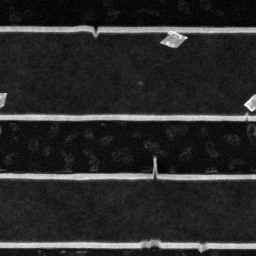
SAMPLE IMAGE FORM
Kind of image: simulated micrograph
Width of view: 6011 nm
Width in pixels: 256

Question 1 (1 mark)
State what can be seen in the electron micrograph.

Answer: one or a few lines or trenches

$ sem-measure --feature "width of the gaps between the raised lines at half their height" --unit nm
1370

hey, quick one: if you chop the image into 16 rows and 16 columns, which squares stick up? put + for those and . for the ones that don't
................
................
++++++++++++++++
++++++++++++++++
++++++++++++++++
++++++++++++++++
++++++++++++++++
................
................
................
................
++++++++++++++++
++++++++++++++++
++++++++++++++++
++++++++++++++++
................